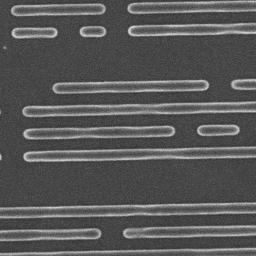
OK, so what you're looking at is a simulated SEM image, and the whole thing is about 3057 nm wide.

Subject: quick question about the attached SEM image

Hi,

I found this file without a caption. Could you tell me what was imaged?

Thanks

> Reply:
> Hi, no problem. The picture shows groups of lines, slits or small figures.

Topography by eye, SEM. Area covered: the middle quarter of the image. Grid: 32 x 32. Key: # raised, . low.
................................
................................
................................
................................
.................##.############
################################
################################
................................
................................
................................
....#####....###################
################################
############....................
................................
................................
................................
############################....
###########################.....
##..............................
................................
................................
................################
################################
#######################......###
................................
................................
................................
................................
................................
................................
................................
................................